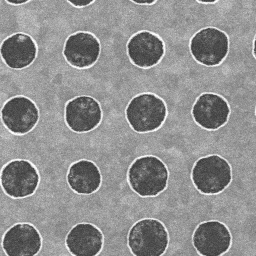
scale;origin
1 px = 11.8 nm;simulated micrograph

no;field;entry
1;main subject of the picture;a regular array of holes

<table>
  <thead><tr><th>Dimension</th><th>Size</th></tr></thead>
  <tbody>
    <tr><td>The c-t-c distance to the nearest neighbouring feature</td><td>750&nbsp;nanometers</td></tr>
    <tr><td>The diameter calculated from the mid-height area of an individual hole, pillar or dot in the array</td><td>444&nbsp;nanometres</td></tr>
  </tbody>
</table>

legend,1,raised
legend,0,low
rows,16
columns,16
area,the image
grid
1111111111111111
1111111111111111
0011001100110011
0011001100110011
1111111111111111
1111111111111111
0011001100110011
0011001100110011
1111111111111111
1111111111111111
0011001100110011
0011001100110011
1111111111111111
1111111111111111
0011001100110011
0011001100110011